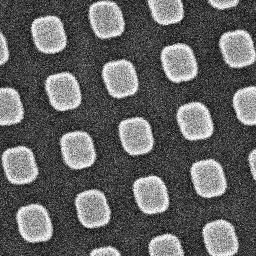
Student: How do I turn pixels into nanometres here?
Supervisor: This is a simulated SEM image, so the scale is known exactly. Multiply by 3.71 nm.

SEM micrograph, a regular array of raised bodies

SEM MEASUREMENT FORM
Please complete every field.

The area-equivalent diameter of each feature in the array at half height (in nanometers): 128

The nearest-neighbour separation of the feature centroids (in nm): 220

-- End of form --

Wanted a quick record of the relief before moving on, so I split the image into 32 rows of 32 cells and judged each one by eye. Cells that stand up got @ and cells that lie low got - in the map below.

------------@@-----@@@@----@@---
-----------@@@@----@@@@---------
-----@@----@@@@-----@@----------
----@@@@----@@@-----------------
----@@@@----@@--------------@@@-
@----@@@--------------------@@@-
@-------------------@@@@----@@@@
@-------------------@@@@----@@@@
-------------@@@@----@@@--------
-------@@----@@@@----@@@--------
------@@@@---@@@@---------------
@@----@@@@----@@@-------------@@
@@----@@@@-------------------@@@
@@@----@@--------------@@@----@@
@@@-------------------@@@@----@@
---------------@@@-----@@@------
---------------@@@@----@@@------
--------@@@----@@@@-------------
--------@@@@----@@@-------------
-@@@----@@@@-------------------@
-@@@-----@@--------------@@----@
-@@@@-------------------@@@@----
-@@@--------------@@----@@@@----
-----------------@@@@---@@@@----
----------@@@----@@@@-----------
----------@@@----@@@@-----------
--@@@@----@@@@----@-------------
--@@@@----@@@-------------------
---@@@--------------------@@@---
---@@@---------------@----@@@---
-------------------@@@----@@@@--
------------@@@----@@@@---@@@---